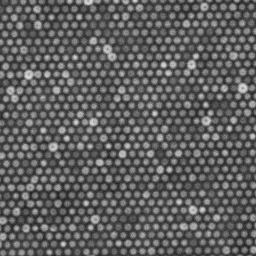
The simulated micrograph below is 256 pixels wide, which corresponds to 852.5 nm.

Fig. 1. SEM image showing a regular array of raised bodies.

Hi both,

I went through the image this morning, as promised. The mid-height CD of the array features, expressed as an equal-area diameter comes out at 17.2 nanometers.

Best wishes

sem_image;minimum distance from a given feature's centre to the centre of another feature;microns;0.0298